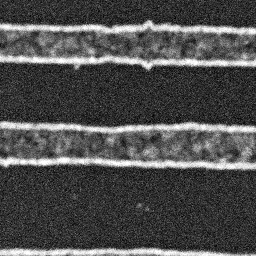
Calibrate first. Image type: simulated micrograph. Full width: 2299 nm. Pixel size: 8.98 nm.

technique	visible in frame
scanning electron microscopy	one or a few lines or trenches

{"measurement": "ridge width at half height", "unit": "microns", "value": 0.304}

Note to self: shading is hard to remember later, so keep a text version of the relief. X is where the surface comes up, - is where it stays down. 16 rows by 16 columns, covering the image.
----------------
----------------
XXXXXXXXXXXXXXXX
XXXXXXXXXXXXXXXX
----------------
----------------
----------------
----------------
XXXXXXXXXXXXXXXX
XXXXXXXXXXXXXXXX
----------------
----------------
----------------
----------------
----------------
----------------